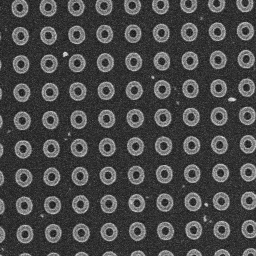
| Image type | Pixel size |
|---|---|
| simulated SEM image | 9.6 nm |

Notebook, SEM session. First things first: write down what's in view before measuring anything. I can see a regular array of ring-shaped raised bodies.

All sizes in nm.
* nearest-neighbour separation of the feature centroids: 268